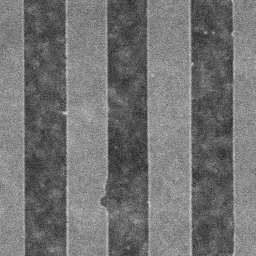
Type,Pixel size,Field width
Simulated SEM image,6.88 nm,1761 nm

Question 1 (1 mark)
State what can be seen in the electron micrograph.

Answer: one or a few lines or trenches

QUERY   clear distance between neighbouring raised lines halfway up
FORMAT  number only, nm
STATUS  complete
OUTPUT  296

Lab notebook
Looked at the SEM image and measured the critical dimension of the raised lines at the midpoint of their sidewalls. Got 0.28 microns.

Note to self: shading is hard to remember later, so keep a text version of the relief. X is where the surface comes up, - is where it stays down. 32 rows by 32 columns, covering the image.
XXX-----XXXXX------XXXXX-----XXX
XXX-----XXXXX------XXXXX-----XXX
XXX-----XXXXX------XXXXX-----XXX
XXX-----XXXXX------XXXXX-----XXX
XXX-----XXXXX-----XXXXXX-----XXX
XXX-----XXXXX-----XXXXXX-----XXX
XXX-----XXXXX-----XXXXXX-----XXX
XXX-----XXXXX-----XXXXXX-----XXX
XXX-----XXXXX-----XXXXXX-----XXX
XXX-----XXXXX-----XXXXXX-----XXX
XXX-----XXXXX-----XXXXXX-----XXX
XXX-----XXXXX-----XXXXXX-----XXX
XXX-----XXXXX-----XXXXXX-----XXX
XXX-----XXXXX-----XXXXXX-----XXX
XXX-----XXXXX-----XXXXXX-----XXX
XXX-----XXXXX-----XXXXXX-----XXX
XXX-----XXXXX-----XXXXXX-----XXX
XXX-----XXXXX------XXXXX-----XXX
XXX-----XXXXX------XXXXX-----XXX
XXX-----XXXXX------XXXXX-----XXX
XXX-----XXXXX------XXXXX-----XXX
XXX-----XXXXX------XXXXX-----XXX
XXX-----XXXXX------XXXXX-----XXX
XXX-----XXXXX------XXXXX-----XXX
XXX-----XXXXX------XXXXX-----XXX
XXX-----XXXXX------XXXXX-----XXX
XXX-----XXXXX------XXXXX-----XXX
XXX-----XXXXX------XXXXX-----XXX
XXX-----XXXXX------XXXXX-----XXX
XXX-----XXXXX------XXXXX-----XXX
XXX-----XXXXX------XXXXX-----XXX
XXX-----XXXXX------XXXXX-----XXX